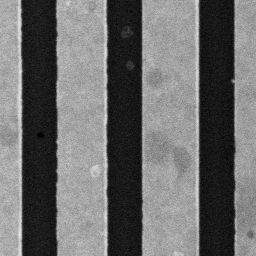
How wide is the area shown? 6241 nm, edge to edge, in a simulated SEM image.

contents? lines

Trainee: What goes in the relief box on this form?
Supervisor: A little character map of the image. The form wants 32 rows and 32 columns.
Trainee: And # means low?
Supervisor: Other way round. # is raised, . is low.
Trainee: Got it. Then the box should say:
###....######.....#######....###
###....######.....#######....###
###....######.....#######....###
###....######.....#######....###
###....######.....#######....###
###....######.....#######....###
###....######.....#######....###
###....######.....#######....###
###....######.....#######....###
###....######.....#######....###
###....######.....#######....###
###....######.....#######....###
###....######.....#######....###
###....######.....#######....###
###....######.....#######....###
###....######.....#######....###
###....######.....#######....###
###....######.....#######....###
###....######.....#######.....##
###....######.....#######....###
###....######.....#######....###
###....######.....#######....###
###....######.....#######....###
###....######.....#######....###
###....######.....#######....###
###....######.....#######....###
###....######.....#######.....##
###....######.....#######....###
###....######.....#######....###
###....######.....#######....###
###....######.....#######....###
###....######.....#######....###